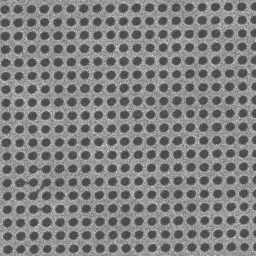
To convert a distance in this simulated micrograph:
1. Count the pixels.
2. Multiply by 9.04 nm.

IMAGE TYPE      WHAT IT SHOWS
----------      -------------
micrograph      a regular array of holes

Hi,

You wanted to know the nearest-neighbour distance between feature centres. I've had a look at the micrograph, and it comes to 116 nm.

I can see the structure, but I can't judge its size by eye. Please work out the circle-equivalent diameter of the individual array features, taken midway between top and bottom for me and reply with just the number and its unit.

83.5 nm